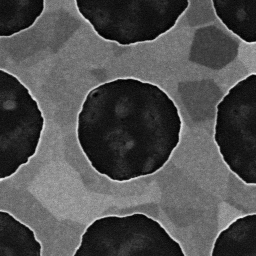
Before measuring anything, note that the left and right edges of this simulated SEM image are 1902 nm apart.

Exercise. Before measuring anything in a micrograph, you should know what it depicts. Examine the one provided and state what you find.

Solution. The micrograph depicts holes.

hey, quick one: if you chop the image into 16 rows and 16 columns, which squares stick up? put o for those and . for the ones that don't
...oo.......o...
..oooo.....ooo..
ooooooo..oooooo.
oooooooooooooooo
oooooooooooooooo
..oooo....oooo..
..ooo......ooo..
...oo......ooo..
...oo......oo...
..ooo......ooo..
.ooooo....oooo..
oooooooooooooooo
oooooooooooooooo
.ooooooo.oooooo.
..ooo.....oooo..
...oo......oo...